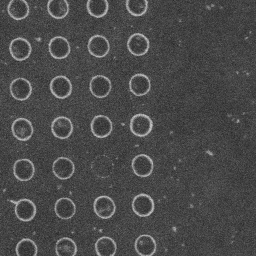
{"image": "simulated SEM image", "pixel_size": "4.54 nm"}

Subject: a regular array of raised bodies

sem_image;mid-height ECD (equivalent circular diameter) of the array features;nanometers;95.2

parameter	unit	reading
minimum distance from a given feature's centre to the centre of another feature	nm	179